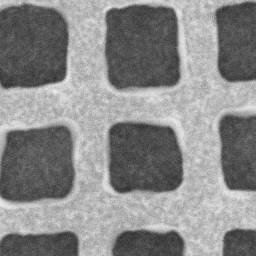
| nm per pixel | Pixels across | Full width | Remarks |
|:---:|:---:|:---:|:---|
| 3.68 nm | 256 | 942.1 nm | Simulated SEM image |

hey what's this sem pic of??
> holes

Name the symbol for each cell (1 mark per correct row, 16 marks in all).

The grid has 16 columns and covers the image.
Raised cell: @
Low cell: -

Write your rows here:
----@@@----@@@--
----@@@----@@@--
----@@@----@@@--
----@@-----@@@--
----@@@----@@@--
-@@@@@@----@@@@@
@@@@@@@@@@@@@@@@
@@@@@@@@-@@@@@--
-----@@----@@@--
-----@@----@@@--
-----@@----@@@--
-----@@----@@@--
----@@@@@@@@@@@@
@@@@@@@@@@@@@@@@
@@@-@@@@---@@@--
-----@@-----@@--